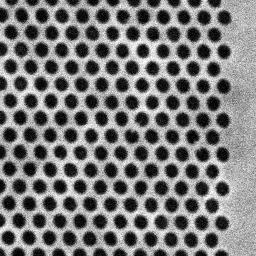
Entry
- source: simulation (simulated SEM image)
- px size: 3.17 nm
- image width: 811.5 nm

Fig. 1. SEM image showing a regular array of holes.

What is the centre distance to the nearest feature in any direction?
0.0624 µm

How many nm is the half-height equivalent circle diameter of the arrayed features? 45.2